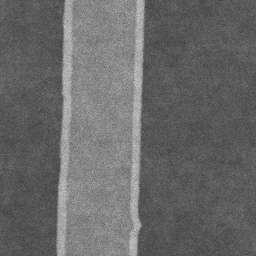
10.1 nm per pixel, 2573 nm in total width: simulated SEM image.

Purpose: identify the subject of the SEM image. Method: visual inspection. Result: one or a few lines or trenches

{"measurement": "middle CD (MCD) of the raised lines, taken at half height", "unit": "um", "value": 0.712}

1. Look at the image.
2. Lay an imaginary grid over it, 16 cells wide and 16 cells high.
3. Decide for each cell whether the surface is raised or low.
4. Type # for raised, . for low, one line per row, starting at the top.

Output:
....#####.......
....#####.......
....#####.......
....#####.......
....#####.......
....#####.......
....#####.......
....#####.......
....####........
....####........
....####........
....####........
....####........
....####........
....####........
....####........